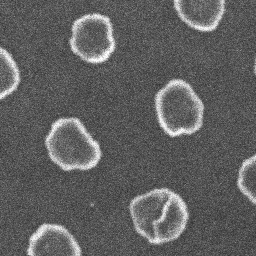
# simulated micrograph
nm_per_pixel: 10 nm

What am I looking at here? raised bodies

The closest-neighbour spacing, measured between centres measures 1090 nanometres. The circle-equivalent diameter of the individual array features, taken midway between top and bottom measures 492 nanometers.